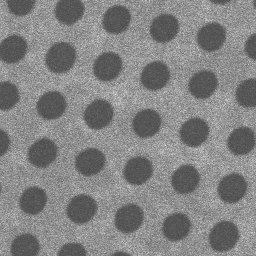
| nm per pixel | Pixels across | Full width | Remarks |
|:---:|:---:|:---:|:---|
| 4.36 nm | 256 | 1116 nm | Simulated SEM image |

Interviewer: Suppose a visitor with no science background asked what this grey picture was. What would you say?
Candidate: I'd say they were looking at a regular array of holes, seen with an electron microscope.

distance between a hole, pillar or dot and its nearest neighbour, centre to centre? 48 px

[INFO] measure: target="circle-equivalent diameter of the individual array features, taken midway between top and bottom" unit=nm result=123